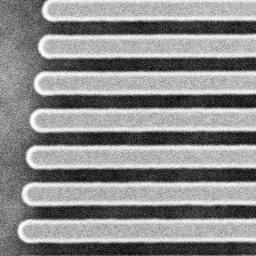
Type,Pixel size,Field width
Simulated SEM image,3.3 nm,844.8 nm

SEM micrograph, groups of lines, slits or small figures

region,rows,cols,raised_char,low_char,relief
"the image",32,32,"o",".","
......oooooooooooooooooooooooooo
.....ooooooooooooooooooooooooooo
......o..oo..oo.................
................................
................oo.ooooooooooooo
.....ooooooooooooooooooooooooooo
.....ooooooooooooooooooooooooooo
................................
................................
.....ooooooooooooooooooooooooooo
.....ooooooooooooooooooooooooooo
.....ooooooooooooooooooooooooooo
................................
................................
....oooooooooooooooooooooooooooo
....oooooooooooooooooooooooooooo
................................
................................
....oooooooooooooooooooooooooooo
...ooooooooooooooooooooooooooooo
....oooooooooooooooooooooooooooo
................................
................................
...ooooooooooooooooooooooooooooo
...ooooooooooooooooooooooooooooo
....ooooo.......................
................................
...........o.oo..ooo..oooooooooo
...ooooooooooooooooooooooooooooo
...ooooooooooooooooooooooooooooo
................................
................................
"